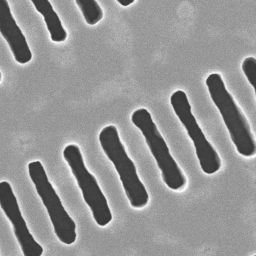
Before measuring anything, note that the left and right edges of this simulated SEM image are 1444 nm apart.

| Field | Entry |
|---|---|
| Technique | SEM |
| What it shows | holes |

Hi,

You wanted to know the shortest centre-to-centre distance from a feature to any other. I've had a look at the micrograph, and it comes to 225 nanometers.